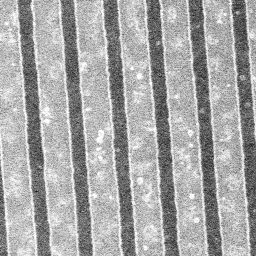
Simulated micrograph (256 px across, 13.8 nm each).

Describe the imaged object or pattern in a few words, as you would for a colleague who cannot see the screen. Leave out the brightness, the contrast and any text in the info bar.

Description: parallel lines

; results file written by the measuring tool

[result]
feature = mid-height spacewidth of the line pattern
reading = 372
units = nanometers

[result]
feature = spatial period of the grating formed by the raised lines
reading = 589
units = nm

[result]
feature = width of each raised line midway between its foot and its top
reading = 212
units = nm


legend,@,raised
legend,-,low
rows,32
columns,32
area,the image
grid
--@@---@@----@@---@@---@@----@@-
--@@----@----@@---@@---@@@---@@-
--@@----@@---@@---@@----@@---@@-
--@@----@@---@@---@@----@@---@@-
--@@----@@---@@---@@----@@---@@-
--@@----@@---@@---@@----@@---@@-
--@@----@@---@@----@@---@@---@@-
---@@---@@---@@----@@---@@---@@-
---@@---@@---@@----@@---@@---@@-
---@@---@@----@----@@---@@---@@-
---@@---@@----@@---@@---@@----@@
---@@---@@----@@---@@---@@----@@
---@@---@@----@@---@@---@@----@@
---@@---@@----@@---@@----@----@@
---@@---@@----@@---@@----@----@@
---@@----@@---@@---@@----@@---@@
---@@----@@---@@---@@----@@---@@
---@@----@@---@@---@@----@@---@@
---@@----@@---@@----@----@@---@@
---@@@---@@---@@----@@---@@---@@
----@@---@@---@@----@@---@@---@@
----@@---@@---@@----@@---@@---@@
----@@---@@---@@----@@---@@---@@
@---@@---@@----@----@@---@@----@
@---@@---@@----@@---@@---@@----@
@---@@---@@----@@---@@---@@----@
@---@@---@@----@@---@@---@@----@
@---@@---@@@---@@---@@----@@---@
@---@@----@@---@@---@@----@@---@
@---@@----@@---@@---@@----@@---@
@---@@----@@---@@---@@----@@---@
@----@----@@---@@---@@----@@---@